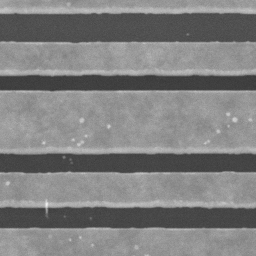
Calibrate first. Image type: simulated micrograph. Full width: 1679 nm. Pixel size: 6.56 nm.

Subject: lines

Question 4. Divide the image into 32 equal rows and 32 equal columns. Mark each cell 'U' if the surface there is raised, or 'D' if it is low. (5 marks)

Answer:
UUUUUUUUUUUUUUUUUUUUUUUUUUUUUUUU
UUUUUUUUUUUUUUUUUUUUUUUUUDDUUUUU
DDDDDDDDDDDDDDDDDDDDDDDDDDDDDDDD
DDDDDDDDDDDDDDDDDDDDDDDDDDDDDDDD
DDDDDDDDDDDDDDDDDDDDDDDDDDDDDDDD
UUUUUUUUUUUUUUUUUUUUUUUUUUUUUUUU
UUUUUUUUUUUUUUUUUUUUUUUUUUUUUUUU
UUUUUUUUUUUUUUUUUUUUUUUUUUUUUUUU
UUUUUUUUUUUUUUUUUUUUUUUUUUUUUUUU
DDDDDDDDDDDDDDDDDDDDDDDDDDDDDDDD
DDDDDDDDDDDDDDDDDDDDDDDDDDDDDDDD
UUUUUUUUUUUUUUUUUUUUUUUUUUUUUUUU
UUUUUUUUUUUUUUUUUUUUUUUUUUUUUUUU
UUUUUUUUUUUUUUUUUUUUUUUUUUUUUUUU
UUUUUUUUUUUUUUUUUUUUUUUUUUUUUUUU
UUUUUUUUUUUUUUUUUUUUUUUUUUUUUUUU
UUUUUUUUUUUUUUUUUUUUUUUUUUUUUUUU
UUUUUUUUUUUUUUUUUUUUUUUUUUUUUUUU
UUUUUUUUUUUUUUUUUUUUUUUUUUUUUUUU
DDDDDDDDDDDDDDDDDDDDDDDDDDDDDDDD
DDDDDDDDDDDDDDDDDDDDDDDDDDDDDDDD
DDDDDDDDDDDDDDDDDDDDDDDDDDDDDDDD
UUUUUUUUUUUUUUUUUUUUUUUUUUUUUUUU
UUUUUUUUUUUUUUUUUUUUUUUUUUUUUUUU
UUUUUUUUUUUUUUUUUUUUUUUUUUUUUUUU
UUUUUUUUUUUUUUUUUUUUUUUUUUUUUUUU
DDDDDDDDDDDDDDDDDDDDDDDDDDDDDDDD
DDDDDDDDDDDDDDDDDDDDDDDDDDDDDDDD
DDDDDDDDDDDDDDDDDDDDDDDDDDDDDDDD
UUUUUUUUUUUUUUUUUUUUUUUUUUUUUUUU
UUUUUUUUUUUUUUUUUUUUUUUUUUUUUUUU
UUUUUUUUUUUUUUUUUUUUUUUUUUUUUUUU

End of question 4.